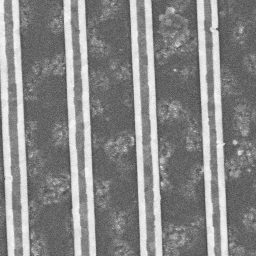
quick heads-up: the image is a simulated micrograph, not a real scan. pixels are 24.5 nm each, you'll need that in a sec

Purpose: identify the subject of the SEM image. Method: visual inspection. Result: one or a few lines or trenches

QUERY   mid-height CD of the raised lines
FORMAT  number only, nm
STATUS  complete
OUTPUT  361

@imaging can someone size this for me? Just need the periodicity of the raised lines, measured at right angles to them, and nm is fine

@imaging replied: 1620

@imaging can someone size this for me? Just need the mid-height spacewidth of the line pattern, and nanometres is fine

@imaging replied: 1270